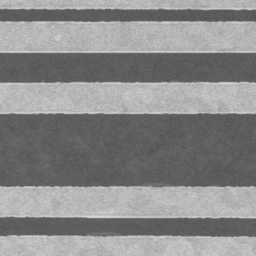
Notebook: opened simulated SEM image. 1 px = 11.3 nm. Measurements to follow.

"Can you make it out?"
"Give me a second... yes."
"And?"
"lines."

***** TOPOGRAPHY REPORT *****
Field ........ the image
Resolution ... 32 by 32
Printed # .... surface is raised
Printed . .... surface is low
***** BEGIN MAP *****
################################
................................
................................
################################
################################
################################
................................
................................
................................
................................
################################
################################
################################
################################
................................
................................
................................
................................
................................
................................
................................
................................
................................
################################
################################
################################
################################
................................
................................
.###.#.....####.................
################################
################################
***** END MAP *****